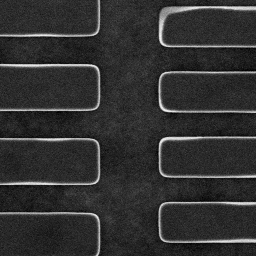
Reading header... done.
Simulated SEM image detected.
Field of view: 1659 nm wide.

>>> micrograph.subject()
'groups of lines, slits or small figures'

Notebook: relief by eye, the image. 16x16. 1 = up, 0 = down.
1111110000001110
1111110000111111
0000000000111111
0000000000000000
1111110000000000
1111110000111111
1111110000111111
0000000000000000
0000000000000000
1111110000111111
1111110000111111
1001110000000000
0000000000000000
1111110000111111
1111110000111111
1111110000000000